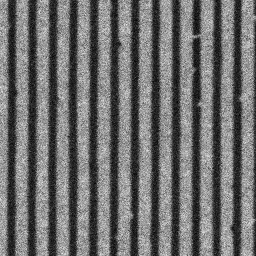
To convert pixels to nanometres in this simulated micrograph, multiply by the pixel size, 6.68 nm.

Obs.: parallel lines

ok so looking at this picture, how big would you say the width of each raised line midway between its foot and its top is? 82.7 nm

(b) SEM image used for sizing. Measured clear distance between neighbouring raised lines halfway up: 53.4 nanometres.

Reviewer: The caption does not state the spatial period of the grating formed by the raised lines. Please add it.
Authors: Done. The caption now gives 137 nanometres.